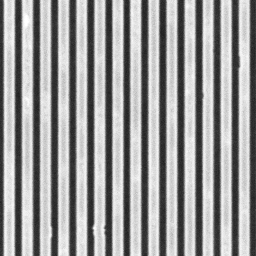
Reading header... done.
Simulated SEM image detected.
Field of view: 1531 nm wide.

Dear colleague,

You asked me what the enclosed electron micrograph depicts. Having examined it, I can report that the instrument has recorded parallel lines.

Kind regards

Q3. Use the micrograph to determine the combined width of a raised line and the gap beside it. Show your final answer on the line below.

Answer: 0.108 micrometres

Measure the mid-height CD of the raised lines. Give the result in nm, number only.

63.6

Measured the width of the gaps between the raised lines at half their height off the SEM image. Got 47.9 nanometers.